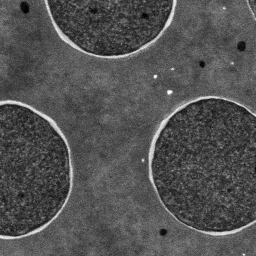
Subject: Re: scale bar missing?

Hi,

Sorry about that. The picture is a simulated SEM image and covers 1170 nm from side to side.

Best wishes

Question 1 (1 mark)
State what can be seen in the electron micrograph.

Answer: holes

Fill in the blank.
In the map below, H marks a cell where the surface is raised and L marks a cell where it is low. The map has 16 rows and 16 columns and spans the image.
HHHLLLLLLLLHHHHH
HHHLLLLLLLHHHHHH
HHHHLLLLLLHHHHHH
HHHHHHLHHHHHHHHH
HHHHHHHHHHHHHHHH
HHHHHHHHHHHHHHHH
LHHHHHHHHHHHLLLH
LLLHHHHHHHLLLLLL
LLLLHHHHHHLLLLLL
LLLLHHHHHHLLLLLL
LLLLHHHHHLLLLLLL
LLLLHHHHHHLLLLLL
LLLLHHHHHHLLLLLL
LLLHHHHHHHHLLLLL
LLHHHHHHHHHHHLHH
HHHHHHHHHHHHHHHH